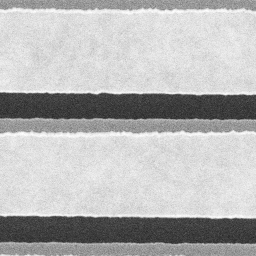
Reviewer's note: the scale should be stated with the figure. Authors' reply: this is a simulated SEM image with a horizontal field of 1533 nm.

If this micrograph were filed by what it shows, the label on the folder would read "lines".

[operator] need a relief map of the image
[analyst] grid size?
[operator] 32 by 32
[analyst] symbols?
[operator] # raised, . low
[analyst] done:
################################
################################
################################
################################
################################
################################
################################
################################
################################
################################
################################
...#############################
................................
................................
................................
################################
################################
################################
################################
################################
################################
################################
################################
################################
################################
################################
################################
................................
................................
................................
##########..#####.###..#........
################################